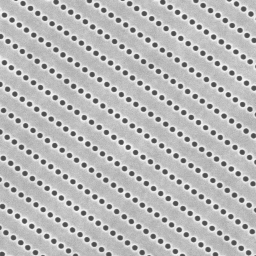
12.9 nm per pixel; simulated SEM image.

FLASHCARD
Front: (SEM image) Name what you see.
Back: a regular array of holes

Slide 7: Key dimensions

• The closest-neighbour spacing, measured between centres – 112 nm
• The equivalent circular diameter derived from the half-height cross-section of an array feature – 5.53 px